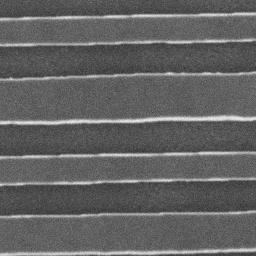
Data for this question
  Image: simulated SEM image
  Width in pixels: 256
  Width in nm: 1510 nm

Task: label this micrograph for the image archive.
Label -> lines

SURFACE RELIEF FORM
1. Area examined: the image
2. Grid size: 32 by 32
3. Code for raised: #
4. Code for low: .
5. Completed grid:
................................
................................
################################
################################
################################
############....................
................................
................................
................................
...........#####################
################################
################################
################################
################################
################################
................................
................................
................................
................................
.......#########################
################################
################################
############################....
................................
................................
................................
...............................#
################################
################################
################################
################################
#########################.......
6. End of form